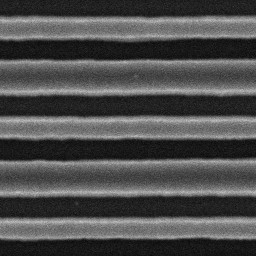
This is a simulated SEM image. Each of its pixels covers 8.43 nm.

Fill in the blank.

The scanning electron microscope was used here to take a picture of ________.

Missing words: lines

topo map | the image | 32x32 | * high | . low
................................
................................
********************************
********************************
********************************
................................
................................
................................
********************************
********************************
********************************
********************...*********
................................
................................
................................
********************************
********************************
................................
................................
................................
********************************
********************************
********************************
********************************
................................
................................
................................
....................*..*..*****.
********************************
********************************
................................
................................